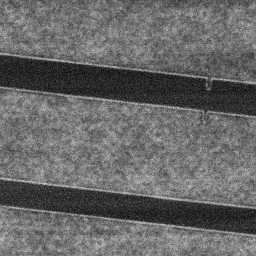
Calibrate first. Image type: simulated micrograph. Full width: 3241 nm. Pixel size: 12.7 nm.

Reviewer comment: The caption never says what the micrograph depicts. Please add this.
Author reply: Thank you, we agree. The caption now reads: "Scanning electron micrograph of one or a few lines or trenches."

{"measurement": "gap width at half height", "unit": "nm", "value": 1140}